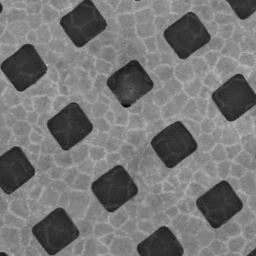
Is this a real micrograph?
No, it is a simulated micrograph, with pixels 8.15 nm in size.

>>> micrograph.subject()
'holes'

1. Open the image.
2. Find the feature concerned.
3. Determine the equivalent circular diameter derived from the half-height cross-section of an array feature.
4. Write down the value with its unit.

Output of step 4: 342 nanometers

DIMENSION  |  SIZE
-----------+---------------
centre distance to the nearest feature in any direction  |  0.604 microns